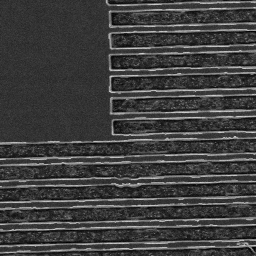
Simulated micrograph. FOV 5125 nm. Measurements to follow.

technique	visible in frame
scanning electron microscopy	parallel lines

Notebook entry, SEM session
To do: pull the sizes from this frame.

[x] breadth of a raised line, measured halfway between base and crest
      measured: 0.145 µm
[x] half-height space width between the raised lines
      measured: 290 nanometers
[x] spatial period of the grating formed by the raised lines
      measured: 434 nm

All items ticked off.